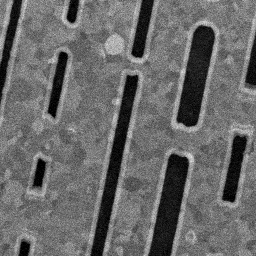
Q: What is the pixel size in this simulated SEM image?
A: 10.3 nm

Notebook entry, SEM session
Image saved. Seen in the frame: one or a few lines or trenches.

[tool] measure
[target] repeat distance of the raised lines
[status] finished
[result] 64.2 pixels